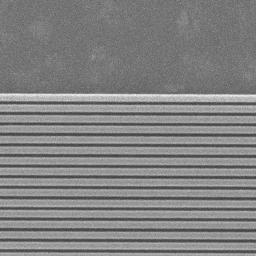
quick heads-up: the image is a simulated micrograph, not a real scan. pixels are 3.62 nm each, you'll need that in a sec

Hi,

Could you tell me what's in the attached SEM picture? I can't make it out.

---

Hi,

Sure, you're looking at parallel lines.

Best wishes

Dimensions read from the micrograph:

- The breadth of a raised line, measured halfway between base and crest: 25.4 nm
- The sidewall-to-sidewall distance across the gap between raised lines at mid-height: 12.7 nm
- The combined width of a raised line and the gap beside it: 0.0383 µm